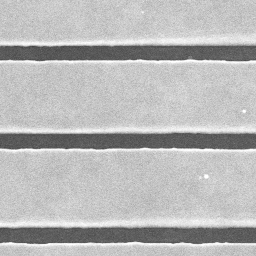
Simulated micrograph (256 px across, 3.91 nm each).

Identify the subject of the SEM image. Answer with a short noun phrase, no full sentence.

lines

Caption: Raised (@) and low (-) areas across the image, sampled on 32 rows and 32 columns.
@@@@@@@@@@@@@@@@@@@@@@@@@@@@@@@@
@@@@@@@@@@@@@@@@@@@@@@@@@@@@@@@@
@@@@@@@@@@@@@@@@@@@@@@@@@@@@@@@@
@@@@@@@@@@@@@@@@@@@@@@@@@@@@@@@@
@@@@@@@@@@@@@@@@@@@@@@@@@@@@@@@@
@@@@@@@@@@@@@@@@@@@@@@@@@@@@@@@@
--------------------------------
--------------------------------
@@@@@@@@@@@@@@@@@@@@@@@@@@@@@@@@
@@@@@@@@@@@@@@@@@@@@@@@@@@@@@@@@
@@@@@@@@@@@@@@@@@@@@@@@@@@@@@@@@
@@@@@@@@@@@@@@@@@@@@@@@@@@@@@@@@
@@@@@@@@@@@@@@@@@@@@@@@@@@@@@@@@
@@@@@@@@@@@@@@@@@@@@@@@@@@@@@@@@
@@@@@@@@@@@@@@@@@@@@@@@@@@@@@@@@
@@@@@@@@@@@@@@@@@@@@@@@@@@@@@@@@
@@@@@@@@@@@@@@@@@@@@@@@@@@@@@@@@
--------------------------------
--------------------------------
@@@@@@@@@@@@@@@@@@@@@@@@@@@@@@@@
@@@@@@@@@@@@@@@@@@@@@@@@@@@@@@@@
@@@@@@@@@@@@@@@@@@@@@@@@@@@@@@@@
@@@@@@@@@@@@@@@@@@@@@@@@@@@@@@@@
@@@@@@@@@@@@@@@@@@@@@@@@@@@@@@@@
@@@@@@@@@@@@@@@@@@@@@@@@@@@@@@@@
@@@@@@@@@@@@@@@@@@@@@@@@@@@@@@@@
@@@@@@@@@@@@@@@@@@@@@@@@@@@@@@@@
@@@@@@@@@@@@@@@@@@@@@@@@@@@@@@@@
--------------------------------
--------------------------------
@@@@@@@@@@@@@@@@@@@@@@@@-@@@@@@@
@@@@@@@@@@@@@@@@@@@@@@@@@@@@@@@@